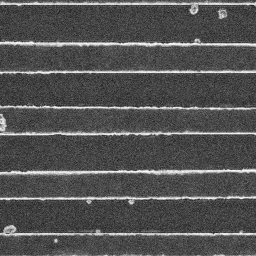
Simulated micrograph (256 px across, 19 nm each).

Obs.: lines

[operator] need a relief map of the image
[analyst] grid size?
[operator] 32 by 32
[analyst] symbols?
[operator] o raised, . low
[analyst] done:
..o............................o
................................
................................
................................
................................
ooooo..ooo..o...o...............
oooooooooooooooooooooooooooooooo
oooooooooooooooooooooooooooooooo
oooooooooooooooooooooooooooooooo
................................
................................
................................
................................
ooooooooooooooooooooooooo.......
oooooooooooooooooooooooooooooooo
oooooooooooooooooooooooooooooooo
oooooooooooooooooooooooooooooooo
................................
................................
................................
................................
...........ooooooooooooooooooooo
oooooooooooooooooooooooooooooooo
oooooooooooooooooooooooooooooooo
oooooooooooooooooooooooooooooooo
................................
................................
................................
................................
oooooooooooooooooooooooooooooooo
oooooooooooooooooooooooooooooooo
oooooooooooooooooooooooooooooooo